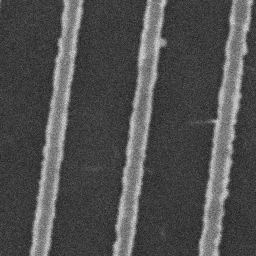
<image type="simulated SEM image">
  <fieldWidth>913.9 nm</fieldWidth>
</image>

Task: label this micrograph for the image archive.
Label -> one or a few lines or trenches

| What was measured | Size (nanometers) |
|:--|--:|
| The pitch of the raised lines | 298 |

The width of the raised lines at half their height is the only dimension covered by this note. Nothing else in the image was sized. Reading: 15.4 pixels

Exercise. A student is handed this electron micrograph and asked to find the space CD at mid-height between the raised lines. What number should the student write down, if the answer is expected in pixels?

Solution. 68.2